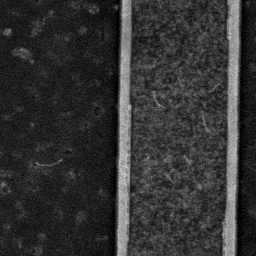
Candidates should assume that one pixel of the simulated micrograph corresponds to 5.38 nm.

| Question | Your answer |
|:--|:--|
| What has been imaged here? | one or a few lines or trenches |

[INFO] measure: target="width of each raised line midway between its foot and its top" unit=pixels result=110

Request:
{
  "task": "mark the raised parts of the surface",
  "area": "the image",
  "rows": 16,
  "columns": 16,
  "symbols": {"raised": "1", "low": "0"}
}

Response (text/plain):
0000000011111110
0000000011111110
0000000011111110
0000000011111110
0000000011111110
0000000011111110
0000000011111110
0000000011111110
0000000011111110
0000000011111110
0000000011111110
0000000011111100
0000000011111100
0000000011111100
0000000011111100
0000000011111100